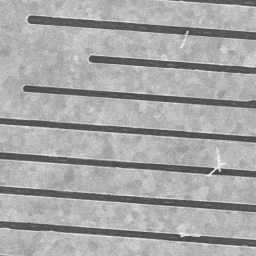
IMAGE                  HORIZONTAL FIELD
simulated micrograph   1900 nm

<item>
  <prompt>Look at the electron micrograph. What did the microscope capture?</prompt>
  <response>parallel lines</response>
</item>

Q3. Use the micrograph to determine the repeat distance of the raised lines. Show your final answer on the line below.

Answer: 255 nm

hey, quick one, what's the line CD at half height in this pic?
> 201 nanometers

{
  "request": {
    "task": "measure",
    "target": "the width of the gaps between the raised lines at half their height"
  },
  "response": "50 nm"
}